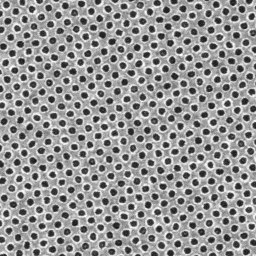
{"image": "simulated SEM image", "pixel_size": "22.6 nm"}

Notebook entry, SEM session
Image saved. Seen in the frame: a regular array of holes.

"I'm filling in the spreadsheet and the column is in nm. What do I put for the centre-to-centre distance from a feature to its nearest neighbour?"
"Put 256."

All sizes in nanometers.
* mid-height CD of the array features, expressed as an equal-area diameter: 180